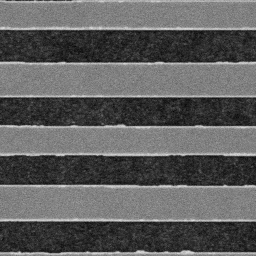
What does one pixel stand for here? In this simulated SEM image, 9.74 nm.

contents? lines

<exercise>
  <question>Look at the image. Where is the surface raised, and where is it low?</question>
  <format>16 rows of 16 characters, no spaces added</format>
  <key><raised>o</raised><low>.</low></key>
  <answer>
oooooooooooooooo
oooooooooooooooo
................
................
oooooooooooooooo
oooooooooooooooo
................
................
oooooooooooooooo
oooooooooooooooo
................
................
oooooooooooooooo
oooooooooooooooo
................
................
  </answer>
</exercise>